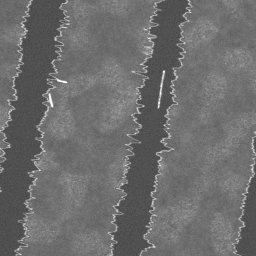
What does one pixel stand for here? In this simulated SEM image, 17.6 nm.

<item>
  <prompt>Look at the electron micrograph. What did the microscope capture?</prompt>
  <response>one or a few lines or trenches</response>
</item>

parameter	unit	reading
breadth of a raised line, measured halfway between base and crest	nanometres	575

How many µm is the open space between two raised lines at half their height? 1.56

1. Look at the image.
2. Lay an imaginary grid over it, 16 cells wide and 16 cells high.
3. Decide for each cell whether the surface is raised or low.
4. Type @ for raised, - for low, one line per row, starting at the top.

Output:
--@@------@@----
-@@@-----@@-----
-@@@-----@@-----
-@@@-----@@-----
-@@------@@-----
-@@------@@-----
-@@------@@-----
-@@------@------
@@@-----@@------
@@@-----@@------
@@------@@------
@@-----@@@------
@@------@@-----@
@@-----@@@-----@
@@-----@@------@
@------@@------@